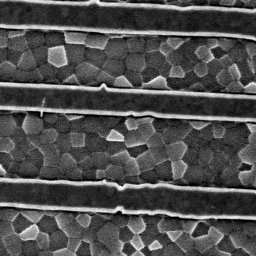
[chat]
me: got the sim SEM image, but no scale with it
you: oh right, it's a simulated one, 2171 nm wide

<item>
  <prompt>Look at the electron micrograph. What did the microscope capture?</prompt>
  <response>one or a few lines or trenches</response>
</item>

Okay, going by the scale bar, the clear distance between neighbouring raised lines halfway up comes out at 0.55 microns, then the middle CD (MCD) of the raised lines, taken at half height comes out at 226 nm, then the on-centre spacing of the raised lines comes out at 90.9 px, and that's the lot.